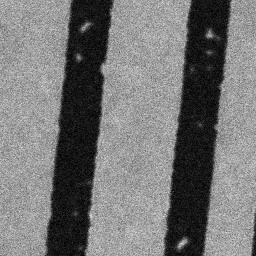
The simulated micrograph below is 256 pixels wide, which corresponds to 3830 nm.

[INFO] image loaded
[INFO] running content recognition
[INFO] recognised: one or a few lines or trenches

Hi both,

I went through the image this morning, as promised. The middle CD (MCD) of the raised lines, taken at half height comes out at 625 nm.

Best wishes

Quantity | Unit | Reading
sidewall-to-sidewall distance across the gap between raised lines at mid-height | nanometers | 1100